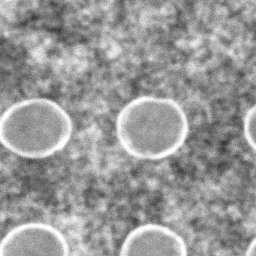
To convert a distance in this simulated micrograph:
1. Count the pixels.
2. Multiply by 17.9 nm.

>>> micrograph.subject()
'raised bodies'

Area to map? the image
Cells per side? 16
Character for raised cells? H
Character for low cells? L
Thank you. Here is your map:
LLLLLLLLLLLLLLLL
LLLLLLLLLLLLLLLL
LLLLLLLLLLLLLLLL
LLLLLLLLLLLLLLLL
LLLLLLLLLLLLLLLL
LLLLLLLLLLLLLLLL
LHHLLLLLHHHLLLLL
HHHHLLLHHHHHLLLH
HHHHLLLHHHHHLLLH
LHHLLLLLHHHLLLLL
LLLLLLLLLLLLLLLL
LLLLLLLLLLLLLLLL
LLLLLLLLLLLLLLLL
LLLLLLLLLLLLLLLL
LHHLLLLLHHHLLLLL
HHHHLLLLHHHLLLLL